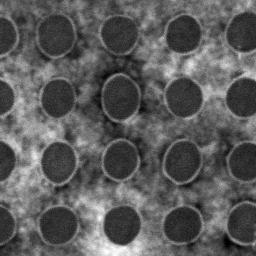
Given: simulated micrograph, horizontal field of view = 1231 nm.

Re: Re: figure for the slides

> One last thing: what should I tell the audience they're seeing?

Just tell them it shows a regular array of raised bodies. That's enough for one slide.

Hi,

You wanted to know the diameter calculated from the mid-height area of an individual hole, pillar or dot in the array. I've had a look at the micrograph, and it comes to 0.196 um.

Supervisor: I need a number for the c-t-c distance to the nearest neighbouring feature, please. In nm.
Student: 301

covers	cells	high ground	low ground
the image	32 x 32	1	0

00000000000000000000000000000000
00000000000000000000000000000011
10000111100001111000011110000111
11000111100001111000011110001111
11000111100011111000011110001111
11000111100001111000011110001111
10000111100000110000001100000011
00000000000000000000000000000000
00000000000000000000000000000000
00000000000000110000000000000010
10000011100001111000011110000111
11000111100001111000011110001111
11000111100001111000011110001111
11000111100001111000011110001111
00000011000000111000001100000111
00000000000000000000000000000000
00000000000000000000000000000000
00000000000000110000000000000000
11000011100001111000011110000111
11000111110001111000011110000111
11000111110001111000111110001111
11000111100001111000011110000111
10000011100000000000011100000011
00000000000000000000000000000000
00000000000000000000000000000000
00000000000000000000000000000011
10000111100001111000011110000111
11000111110001111100111110001111
11000111110001111100111110001111
11000111100001111000011110000111
00000011000000110000001000000001
00000000000000000000000000000000